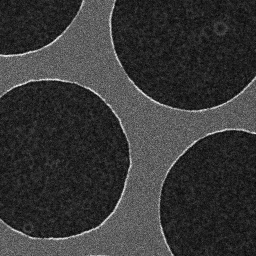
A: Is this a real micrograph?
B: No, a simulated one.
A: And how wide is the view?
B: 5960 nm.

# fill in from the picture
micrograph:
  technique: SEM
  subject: holes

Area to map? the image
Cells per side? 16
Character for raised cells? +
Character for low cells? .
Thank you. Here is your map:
.....++.........
....+++.........
...++++.........
+++++++.........
++++++++........
+....++++......+
.......+++....++
.......+++++++++
........+++++...
........++++....
........+++.....
........++......
.......+++......
.......+++......
++...+++++......
+++++++++++.....